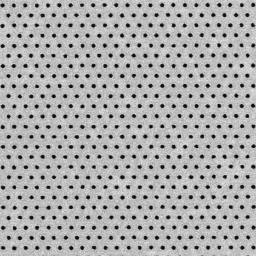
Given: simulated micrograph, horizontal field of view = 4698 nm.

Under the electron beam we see a regular array of holes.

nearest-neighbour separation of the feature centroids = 204 nanometres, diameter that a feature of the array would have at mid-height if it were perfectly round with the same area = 77.5 nm